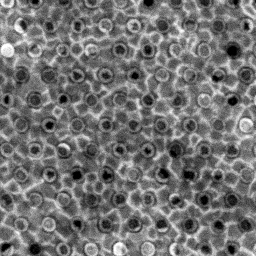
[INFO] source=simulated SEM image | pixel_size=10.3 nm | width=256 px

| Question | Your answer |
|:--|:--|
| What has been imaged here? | a regular array of raised bodies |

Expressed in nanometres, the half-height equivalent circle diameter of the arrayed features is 136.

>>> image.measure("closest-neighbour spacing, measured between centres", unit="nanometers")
288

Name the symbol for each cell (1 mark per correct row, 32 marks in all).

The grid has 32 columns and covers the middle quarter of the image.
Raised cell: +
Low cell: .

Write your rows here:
................................
..++.....++......+......+......+
..+++....+++....+++....+++....++
..+++....+++....+++....+++....++
.................+..............
................................
................................
................................
+....+++.....++.....++.....+++..
+....+++.....++.....++.....+++..
+.....++.....++.....++.....++...
................................
................................
................................
..+++....+++....+++....+++....++
..+++....+++....+++....+++....++
..++.....+++.....++.....++.....+
................................
................................
................................
+....+++.....++.....++.....++...
+....+++.....++.....++.....+++..
+.....++.....++.....++.....++...
................................
................................
................................
..++.....++.....++......+......+
..+++....+++....+++....+++....++
..+++....+++....+++....+++....++
................................
................................
................................